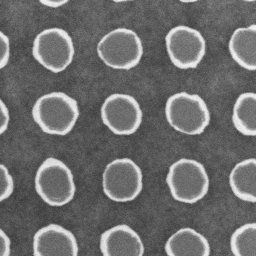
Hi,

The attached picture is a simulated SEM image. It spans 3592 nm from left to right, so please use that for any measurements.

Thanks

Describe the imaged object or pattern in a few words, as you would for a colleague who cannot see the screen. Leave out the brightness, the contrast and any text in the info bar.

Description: a regular array of raised bodies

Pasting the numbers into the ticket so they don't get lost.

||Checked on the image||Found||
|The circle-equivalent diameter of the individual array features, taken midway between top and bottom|550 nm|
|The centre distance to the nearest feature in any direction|0.915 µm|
